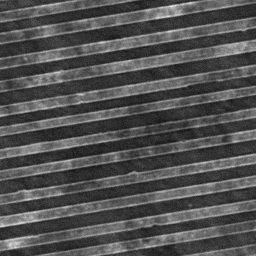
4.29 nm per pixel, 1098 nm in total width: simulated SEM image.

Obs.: parallel lines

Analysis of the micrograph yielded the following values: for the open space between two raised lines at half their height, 55 nanometers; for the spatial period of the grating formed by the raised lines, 96.5 nm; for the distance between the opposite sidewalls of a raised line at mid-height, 0.0381 µm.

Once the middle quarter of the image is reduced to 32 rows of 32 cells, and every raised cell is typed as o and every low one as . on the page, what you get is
........oooooooooooooooo........
..oooooooooooooooo..............
oooooooooooo....................
ooooo.......................oooo
......................oooooooooo
...............ooooooooooooooo..
.........ooooooooooooooo........
...ooooooooooooooo..............
ooooooooooo..................ooo
ooooo..................ooooooooo
..................oooooooooooo..
............oooooooooooo........
......oooooooooooo..............
ooooooooooo.....................
ooooo.......................oooo
.....................ooooooooooo
...............ooooooooooooo....
.........ooooooooooooo..........
...ooooooooooooo................
oooooooooo....................oo
oooo...................ooooooooo
.................ooooooooooooo..
...........ooooooooooooo........
....ooooooooooooo...............
ooooooooooo.....................
ooooo..........................o
........................oooooooo
.................oooooooooooooo.
............ooooooooooooo.......
......ooooooooooooo.............
ooooooooooooo...................
oooooo.....................ooooo